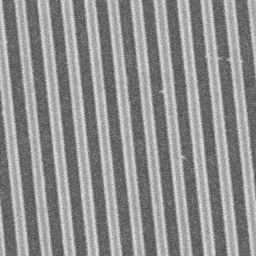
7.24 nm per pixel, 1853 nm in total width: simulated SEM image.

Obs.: parallel lines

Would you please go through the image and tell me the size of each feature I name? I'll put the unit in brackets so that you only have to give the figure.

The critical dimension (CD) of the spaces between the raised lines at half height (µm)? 0.107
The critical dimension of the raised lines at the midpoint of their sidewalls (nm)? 63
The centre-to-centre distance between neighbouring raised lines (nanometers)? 168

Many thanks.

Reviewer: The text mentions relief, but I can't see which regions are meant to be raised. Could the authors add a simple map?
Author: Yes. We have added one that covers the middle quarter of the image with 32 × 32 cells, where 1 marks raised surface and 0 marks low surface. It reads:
01100001100001100001100011100011
01110001100001100001100001100001
01110001100001100001100001100001
00110001100001100001100001100001
00110000110001100001100001100001
00110000110001100001100001100001
00110000110001110001100001100001
00110000110000110000110001100001
00110000110000110000110001110001
00110000110000110000110001110001
00111000110000110000110000110001
00011000110000110000110000110000
00111000110000110000110000110000
00011000011000110000110000110000
00011000011000111000110000110000
00011000011000110000110000110000
00011000011000011000110000110000
00011000011000011000011000111000
00011000011000011000011000111000
00011000011000011000011000111000
00011100011000011000011000011000
00011100011000011000011000011000
00001100011000011000011000011000
00001100001100011000011000011000
00001100001100011000011000011000
00001100001100011100011000011000
00001100001100001100001100011000
00001100001100001100001100011100
00001100001100001100001100011100
10001110001100001100001100001100
10001110001100001100001100001100
10001110001100001100001100001100